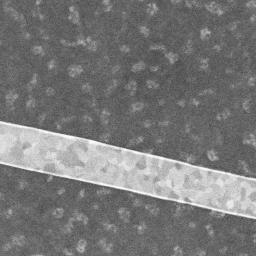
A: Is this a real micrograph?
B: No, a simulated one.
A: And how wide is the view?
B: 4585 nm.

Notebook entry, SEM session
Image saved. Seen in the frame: one or a few lines or trenches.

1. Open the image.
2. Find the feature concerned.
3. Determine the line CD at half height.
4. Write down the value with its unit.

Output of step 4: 688 nanometers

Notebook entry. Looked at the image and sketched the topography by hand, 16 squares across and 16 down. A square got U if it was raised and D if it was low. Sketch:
DDDDDDDDDDDDDDDD
DDDDDDDDDDDDDDDD
DDDDDDDDDDDDDDDD
DDDDDDDDDDDDDDDD
DDDDDDDDDDDDDDDD
DDDDDDDDDDDDDDDD
DDDDDDDDDDDDDDDD
DDDDDDDDDDDDDDDD
UUUUDDDDDDDDDDDD
UUUUUUUUUDDDDDDD
DDUUUUUUUUUUUDDD
DDDDDDUUUUUUUUUU
DDDDDDDDDDDUUUUU
DDDDDDDDDDDDDDDU
DDDDDDDDDDDDDDDD
DDDDDDDDDDDDDDDD